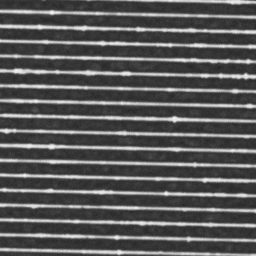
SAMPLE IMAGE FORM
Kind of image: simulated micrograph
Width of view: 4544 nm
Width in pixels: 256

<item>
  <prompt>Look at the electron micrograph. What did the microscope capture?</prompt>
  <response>parallel lines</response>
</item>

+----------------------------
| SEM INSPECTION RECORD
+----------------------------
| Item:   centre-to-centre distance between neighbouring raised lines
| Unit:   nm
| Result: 264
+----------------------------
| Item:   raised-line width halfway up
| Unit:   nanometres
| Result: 44.4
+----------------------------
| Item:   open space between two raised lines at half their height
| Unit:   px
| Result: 12.7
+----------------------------